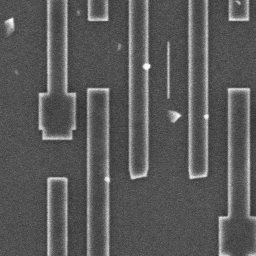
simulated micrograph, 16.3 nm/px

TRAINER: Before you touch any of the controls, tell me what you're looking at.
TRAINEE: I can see wiring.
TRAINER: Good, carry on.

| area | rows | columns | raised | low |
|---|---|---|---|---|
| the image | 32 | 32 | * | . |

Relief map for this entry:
......**...**...**......**...**.
......**...**...**......**...**.
......**........**......**......
......**........**......**......
......**........**......**......
......**........**......**......
......**........**......**......
......**........**......**......
......**........***.....**......
......**........**......**......
......**........**......**......
......***..***..**......**...**.
.....****..***..**......**...**.
.....****..***..**......**...**.
.....****..***..**......**...**.
.....****..***..**......**...**.
.....****..***..**......**...**.
...........***..**......**...**.
...........***..**......**...**.
...........***..**......**...**.
...........***..**......**...**.
...........***..**......**...**.
......**...***...............**.
......**...***...............**.
......**...***...............**.
......**...***...............**.
......**...***...............**.
......**...***.............*****
......**...***.............*****
......**...***.............*****
......**...***.............*****
......**...***.............*****